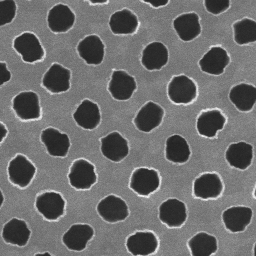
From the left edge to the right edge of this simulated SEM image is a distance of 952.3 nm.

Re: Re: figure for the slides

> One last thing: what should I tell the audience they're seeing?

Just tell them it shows a regular array of holes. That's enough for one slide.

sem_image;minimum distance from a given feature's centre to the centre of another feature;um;0.155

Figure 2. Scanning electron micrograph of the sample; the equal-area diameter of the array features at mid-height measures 100 nm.